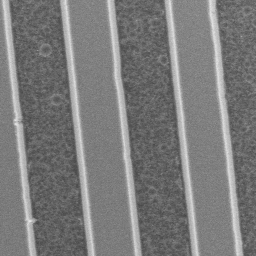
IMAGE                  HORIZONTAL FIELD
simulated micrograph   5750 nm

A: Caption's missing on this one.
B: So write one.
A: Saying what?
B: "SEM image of one or a few lines or trenches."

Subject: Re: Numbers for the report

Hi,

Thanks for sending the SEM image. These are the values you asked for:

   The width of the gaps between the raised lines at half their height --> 1280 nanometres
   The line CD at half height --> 1010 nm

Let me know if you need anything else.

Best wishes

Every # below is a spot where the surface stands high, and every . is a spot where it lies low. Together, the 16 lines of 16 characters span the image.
....###....##...
....###....##...
#...###....###..
#...###....###..
#...###....###..
#....##....###..
#....###...###..
#....###...###..
#....###...###..
#....###....##..
#....###....##..
##...###....###.
##...###....###.
##...###....###.
##....##....###.
##....###...###.